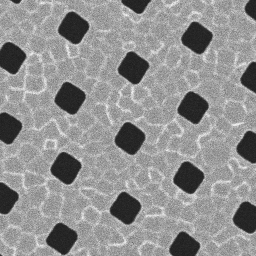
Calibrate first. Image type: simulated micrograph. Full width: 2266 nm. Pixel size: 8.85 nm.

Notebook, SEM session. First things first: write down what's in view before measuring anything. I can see a regular array of holes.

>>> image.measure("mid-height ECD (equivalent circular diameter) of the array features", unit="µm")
0.259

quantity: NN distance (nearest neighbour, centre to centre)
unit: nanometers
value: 621